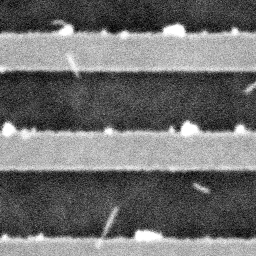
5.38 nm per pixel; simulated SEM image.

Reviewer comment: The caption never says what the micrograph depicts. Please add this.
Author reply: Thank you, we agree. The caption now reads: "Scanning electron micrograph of lines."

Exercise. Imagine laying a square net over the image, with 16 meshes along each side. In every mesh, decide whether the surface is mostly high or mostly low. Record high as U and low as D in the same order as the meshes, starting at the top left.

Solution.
DDDDDDDDDDDDDDDD
DDDDDDDDDDDDDDDD
UUUUUUUUUUUUUUUU
UUUUUUUUUUUUUUUU
DDDDDDDDDDDDDDDD
DDDDDDDDDDDDDDDD
DDDDDDDDDDDDDDDD
DDDDDDDDDDDDDDDD
UUUUUUUUUUUUUUUU
UUUUUUUUUUUUUUUU
UUUUUUUUUUUUUUUU
DDDDDDDDDDDDDDDD
DDDDDDDDDDDDDDDD
DDDDDDDDDDDDDDDD
DDDDDDDDDDDDDDDD
UUUUUUUUUUUUUUUU